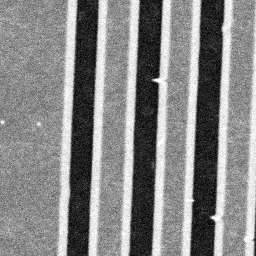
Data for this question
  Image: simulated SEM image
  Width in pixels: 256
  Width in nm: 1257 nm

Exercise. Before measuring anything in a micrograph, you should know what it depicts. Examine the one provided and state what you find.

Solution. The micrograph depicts one or a few lines or trenches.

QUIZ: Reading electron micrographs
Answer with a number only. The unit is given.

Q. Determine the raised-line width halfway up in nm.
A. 162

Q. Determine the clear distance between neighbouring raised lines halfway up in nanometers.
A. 146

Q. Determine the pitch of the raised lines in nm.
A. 306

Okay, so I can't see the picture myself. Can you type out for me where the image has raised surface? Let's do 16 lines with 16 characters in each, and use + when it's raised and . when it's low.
+++++.++..++..++
+++++.++..++..++
++++..++..++..++
++++..++..++..++
++++..++..++..++
++++..++..++..++
++++..++..++..++
++++..++..++..++
++++..++..++..++
++++..++..++..++
++++..++..++..++
++++..++..++..++
++++..++..++..++
++++..++..++..++
++++..++..++..++
++++..++..++..++